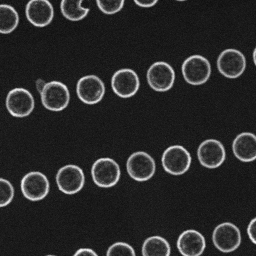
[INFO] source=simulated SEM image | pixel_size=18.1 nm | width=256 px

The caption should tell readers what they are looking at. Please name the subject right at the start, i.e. a regular array of raised bodies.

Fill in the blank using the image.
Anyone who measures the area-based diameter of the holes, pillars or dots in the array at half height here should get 492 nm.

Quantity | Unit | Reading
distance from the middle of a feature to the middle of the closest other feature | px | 35.7